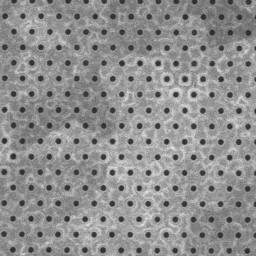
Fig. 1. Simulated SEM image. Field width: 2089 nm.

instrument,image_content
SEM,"a regular array of holes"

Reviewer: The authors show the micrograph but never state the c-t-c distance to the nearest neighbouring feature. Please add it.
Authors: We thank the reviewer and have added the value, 143 nm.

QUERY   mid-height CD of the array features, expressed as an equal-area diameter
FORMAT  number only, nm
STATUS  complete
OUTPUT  50.4